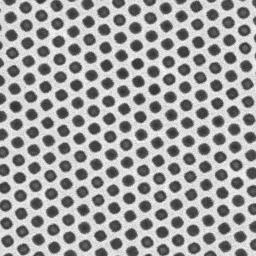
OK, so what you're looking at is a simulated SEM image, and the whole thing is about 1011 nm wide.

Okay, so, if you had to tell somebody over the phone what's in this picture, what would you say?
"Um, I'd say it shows a regular array of holes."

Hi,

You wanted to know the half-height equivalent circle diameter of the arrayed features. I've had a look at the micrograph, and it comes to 0.0504 um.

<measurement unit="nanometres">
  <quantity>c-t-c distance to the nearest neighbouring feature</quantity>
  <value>69.9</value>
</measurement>